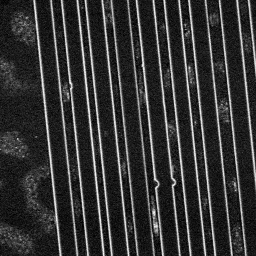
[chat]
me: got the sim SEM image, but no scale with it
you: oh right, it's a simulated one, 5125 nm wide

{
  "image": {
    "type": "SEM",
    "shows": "parallel lines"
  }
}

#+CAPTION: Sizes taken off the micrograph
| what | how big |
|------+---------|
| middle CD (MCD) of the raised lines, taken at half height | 341 nanometers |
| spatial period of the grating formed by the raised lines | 525 nm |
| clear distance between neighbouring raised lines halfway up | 189 nanometers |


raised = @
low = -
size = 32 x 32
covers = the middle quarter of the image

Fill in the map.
-@@@@--@@@@---@@@@--@@@@---@@@--
-@@@@--@@@@---@@@@--@@@@---@@@@-
-@@@@--@@@@---@@@@--@@@@---@@@@-
-@@@@--@@@@@--@@@@--@@@@---@@@@-
--@@@---@@@@--@@@@--@@@@---@@@@-
--@@@@--@@@@--@@@@--@@@@@--@@@@-
--@@@@--@@@@--@@@@---@@@@--@@@@-
--@@@@--@@@@--@@@@---@@@@---@@@-
--@@@@--@@@@--@@@@---@@@@---@@@-
--@@@@--@@@@--@@@@@--@@@@---@@@-
--@@@@--@@@@---@@@@--@@@@---@@@-
--@@@@--@@@@---@@@@--@@@@---@@@@
--@@@@--@@@@---@@@@--@@@@---@@@@
---@@@--@@@@@--@@@@--@@@@---@@@@
---@@@---@@@@--@@@@--@@@@---@@@@
---@@@@--@@@@--@@@@--@@@@@--@@@@
---@@@@--@@@@--@@@@---@@@@--@@@@
---@@@@--@@@@--@@@@---@@@@---@@@
---@@@@--@@@@--@@@@---@@@@---@@@
---@@@@--@@@@--@@@@@--@@@@---@@@
---@@@@--@@@@---@@@@--@@@@---@@@
@--@@@@--@@@@---@@@@--@@@@---@@@
@--@@@@--@@@@---@@@@--@@@@---@@@
@---@@@--@@@@@--@@@@--@@@@---@@@
@---@@@@--@@@@--@@@@--@@@@@--@@@
@---@@@@--@@@@--@@@@---@@@@--@@@
@---@@@@--@@@@--@@@@---@@@@--@@@
@---@@@@--@@@@--@@@@---@@@@---@@
@---@@@@--@@@@--@@@@@--@@@@---@@
@---@@@@--@@@@---@@@@--@@@@@--@@
@---@@@@--@@@@---@@@@--@@@@---@@
@@--@@@@--@@@@---@@@@--@@@@---@@